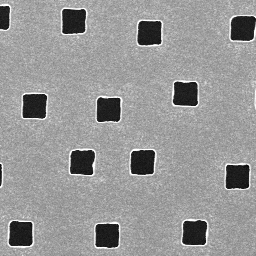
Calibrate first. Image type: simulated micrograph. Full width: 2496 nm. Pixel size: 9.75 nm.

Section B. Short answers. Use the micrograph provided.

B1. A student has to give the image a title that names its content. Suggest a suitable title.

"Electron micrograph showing a regular array of holes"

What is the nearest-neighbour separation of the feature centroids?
691 nm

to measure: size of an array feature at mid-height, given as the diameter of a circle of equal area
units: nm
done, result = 265